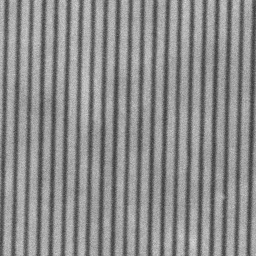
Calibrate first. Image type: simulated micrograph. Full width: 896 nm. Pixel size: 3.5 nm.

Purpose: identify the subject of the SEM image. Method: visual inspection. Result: parallel lines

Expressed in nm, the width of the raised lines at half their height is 23.6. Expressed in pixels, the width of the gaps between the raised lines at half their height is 5.74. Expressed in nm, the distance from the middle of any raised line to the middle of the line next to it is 43.3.